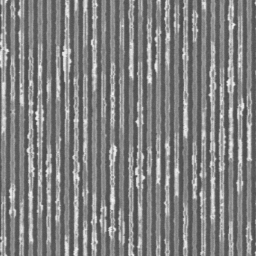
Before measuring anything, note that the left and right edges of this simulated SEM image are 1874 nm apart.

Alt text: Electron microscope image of parallel lines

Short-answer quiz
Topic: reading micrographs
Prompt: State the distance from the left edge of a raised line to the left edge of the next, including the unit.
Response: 66.7 nm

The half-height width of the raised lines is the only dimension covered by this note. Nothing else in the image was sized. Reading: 28.4 nm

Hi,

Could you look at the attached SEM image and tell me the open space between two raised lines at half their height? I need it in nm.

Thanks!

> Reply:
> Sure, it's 35.7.